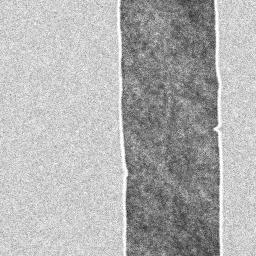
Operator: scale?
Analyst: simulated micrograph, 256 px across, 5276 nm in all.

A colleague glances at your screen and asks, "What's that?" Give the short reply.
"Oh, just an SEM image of one or a few lines or trenches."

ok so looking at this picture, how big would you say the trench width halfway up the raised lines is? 2.01 um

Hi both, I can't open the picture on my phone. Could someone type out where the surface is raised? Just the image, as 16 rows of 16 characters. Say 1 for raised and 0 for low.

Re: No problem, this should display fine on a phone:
1111111000000011
1111111000000011
1111111000000011
1111111000000011
1111111000000011
1111111100000011
1111111100000011
1111111100000011
1111111100000011
1111111100000011
1111111100000011
1111111100000011
1111111100000011
1111111100000011
1111111100000011
1111111100000011